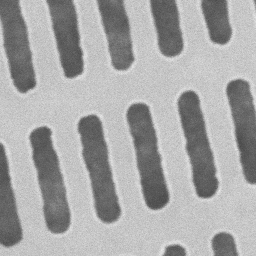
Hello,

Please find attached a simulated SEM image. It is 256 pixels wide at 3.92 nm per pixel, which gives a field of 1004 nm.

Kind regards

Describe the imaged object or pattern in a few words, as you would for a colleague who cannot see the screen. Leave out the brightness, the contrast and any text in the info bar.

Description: holes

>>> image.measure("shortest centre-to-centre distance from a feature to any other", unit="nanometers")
198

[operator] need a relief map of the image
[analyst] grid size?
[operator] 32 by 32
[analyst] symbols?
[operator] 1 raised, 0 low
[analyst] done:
00111100011100011110001110001111
00011100001100001110001110000111
00011100001110001110001111000111
00011110001110001111000111000111
00001110001110001111000111000111
00001110001111001111000111101111
10001110001111000111000111111111
10001110001111000111111111111111
10001111001111001111111111111111
10001111001111111111111111111111
11000111111111111111111111111001
11011111111111111111111011110001
11111111111111111111110001111000
11111111111111110001110001111000
11111111111011110001110001111000
11111111110001110001111000111000
11110011110001110001111000111000
11110011110001111000111000111100
01110001110001111000111000111100
01110001110000111000111100011100
01110001111000111000111100011100
01111000111000111000111100011100
01111000111000111100011100011110
00111000111000111100011100011111
00111000111100011100011110011111
00111000111100011100011111111111
00111000011100011111111111111111
00111100011110111111111111111111
00011100011111111111111111111111
00011111111111111111111111100111
00111111111111111111111111000111
11111111111111111111100111100011